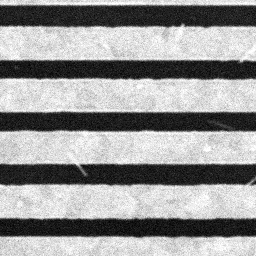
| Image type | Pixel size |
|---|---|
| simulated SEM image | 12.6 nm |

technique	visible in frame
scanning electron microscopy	lines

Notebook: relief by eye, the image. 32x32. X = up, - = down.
XXXXXXXXXXXXXXXXXXXXXXXXXXXXXXXX
--------------------------------
--------------------------------
XXXXXXXXXXXXXXXXXXXXXXXXXXXXXXXX
XXXXXXXXXXXXXXXXXXXXXXXXXXXXXXXX
XXXXXXXXXXXXXXXXXXXXXXXXXXXXXXXX
XXXXXXXXXXXXXXXXXXXXXXXXXXXXXXXX
---------------------------XXXXX
--------------------------------
--------------------------------
XXXXXXXXXXXXXXXXXXXXXXXXXXXXXXXX
XXXXXXXXXXXXXXXXXXXXXXXXXXXXXXXX
XXXXXXXXXXXXXXXXXXXXXXXXXXXXXXXX
XXXXXXXXXXXXXXXXXXXXXXXXXXXXXXXX
--------------------------------
--------------------------------
--XXX-XXXXX------XXX----X--X-X--
XXXXXXXXXXXXXXXXXXXXXXXXXXXXXXXX
XXXXXXXXXXXXXXXXXXXXXXXXXXXXXXXX
XXXXXXXXXXXXXXXXXXXXXXXXXXXXXXXX
---------X----------------------
--------------------------------
--------------------------------
XXXXXXXXXXXXXXXXXXXXXXXXXXXXXXXX
XXXXXXXXXXXXXXXXXXXXXXXXXXXXXXXX
XXXXXXXXXXXXXXXXXXXXXXXXXXXXXXXX
XXXXXXXXXXXXXXXXXXXXXXXXXXXXXXXX
--------------------------------
--------------------------------
--------------------------------
XXXXXXXXXXXXXXXXXXXXXXXXXXXXXXXX
XXXXXXXXXXXXXXXXXXXXXXXXXXXXXXXX